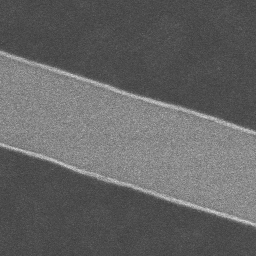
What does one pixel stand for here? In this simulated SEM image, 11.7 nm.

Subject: one or a few lines or trenches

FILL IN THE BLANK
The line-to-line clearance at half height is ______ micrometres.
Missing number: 1.02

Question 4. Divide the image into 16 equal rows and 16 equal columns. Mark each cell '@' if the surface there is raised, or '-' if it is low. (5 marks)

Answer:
@@@@@@@@@@@@@@@@
@@@@@@@@@@@@@@@@
@@@@@@@@@@@@@@@@
-@@@@@@@@@@@@@@@
----@@@@@@@@@@@@
-------@@@@@@@@@
----------@@@@@@
-------------@@@
----------------
@@--------------
@@@@@-----------
@@@@@@@@--------
@@@@@@@@@@@-----
@@@@@@@@@@@@@@--
@@@@@@@@@@@@@@@@
@@@@@@@@@@@@@@@@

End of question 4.